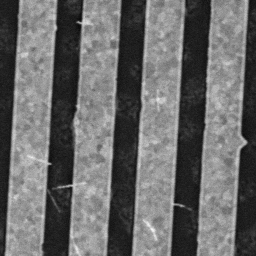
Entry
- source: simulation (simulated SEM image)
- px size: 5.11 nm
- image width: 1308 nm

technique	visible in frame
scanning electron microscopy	one or a few lines or trenches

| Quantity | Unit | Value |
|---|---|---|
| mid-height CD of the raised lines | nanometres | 184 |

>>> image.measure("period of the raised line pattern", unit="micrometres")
0.325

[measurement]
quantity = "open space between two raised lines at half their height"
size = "140 nanometers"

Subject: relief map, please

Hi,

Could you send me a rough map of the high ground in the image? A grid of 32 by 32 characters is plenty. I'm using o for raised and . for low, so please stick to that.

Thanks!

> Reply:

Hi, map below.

...oooo...ooooo...ooooo....oooo.
..ooooo...ooooo...ooooo...ooooo.
..ooooo...ooooo...ooooo...ooooo.
..ooooo...ooooo...ooooo...ooooo.
..ooooo...ooooo...ooooo...ooooo.
..ooooo...ooooo...ooooo...ooooo.
..ooooo...ooooo...ooooo...ooooo.
..ooooo...ooooo...ooooo...oooo..
..oooo....ooooo...ooooo...oooo..
..oooo....oooo....ooooo...oooo..
..oooo....oooo....oooo....oooo..
..oooo....oooo....oooo....oooo..
..oooo....oooo....oooo....oooo..
..oooo....oooo....oooo....oooo..
..oooo...ooooo....oooo....oooo..
..oooo...ooooo....oooo....oooo..
..oooo...ooooo....oooo....oooo..
..oooo...ooooo....oooo....ooooo.
..oooo...ooooo...ooooo...ooooo..
..oooo...ooooo...ooooo...ooooo..
.ooooo...ooooo...ooooo...ooooo..
.ooooo...ooooo...ooooo...ooooo..
.ooooo...ooooo...ooooo...ooooo..
.ooooo...ooooo...ooooo...ooooo..
.ooooo...ooooo...ooooo...oooo...
.ooooo...ooooo...ooooo...oooo...
.oooo....ooooo...ooooo...oooo...
.oooo....oooo....oooo....oooo...
.oooo....oooo....oooo....oooo...
.oooo....oooo....oooo....oooo...
.oooo....oooo....oooo....oooo...
.oooo....oooo....oooo....oooo...